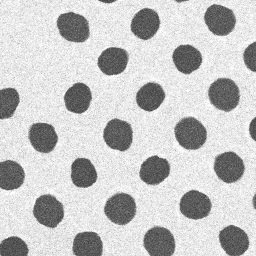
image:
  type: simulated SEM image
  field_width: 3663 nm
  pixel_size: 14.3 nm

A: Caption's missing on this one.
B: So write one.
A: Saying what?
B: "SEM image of a regular array of holes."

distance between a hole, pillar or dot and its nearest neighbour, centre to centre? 726 nanometres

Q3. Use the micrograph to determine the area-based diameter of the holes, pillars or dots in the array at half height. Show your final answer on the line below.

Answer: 436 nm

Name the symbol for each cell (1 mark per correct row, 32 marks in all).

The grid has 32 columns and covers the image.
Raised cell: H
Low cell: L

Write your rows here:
HHHHHHHHHHHHHHHHHHHHHHHHHHHHHHHH
HHHHHHHHHHHHHHHHHLLHHHHHHHLLLHHH
HHHHHHHLLLLHHHHHHLLLHHHHHHLLLHHH
HHHHHHHLLLLHHHHHLLLLHHHHHHLLLHHH
HHHHHHHHLLLHHHHHHLLHHHHHHHHHHHHH
HHHHHHHHHHHHHHHHHHHHHHHHHHHHHHHL
HHHHHHHHHHHHHLLLHHHHHHLLLHHHHHHL
HHHHHHHHHHHHLLLLHHHHHHLLLHHHHHHL
HHHHHHHHHHHHLLLLHHHHHHLLLHHHHHHL
HHHHHHHHHHHHHHHHHHHHHHHHHHHHHHHH
HHHHHHHHHLLHHHHHHHLLHHHHHHHLLHHH
LLHHHHHHLLLHHHHHHLLLHHHHHHLLLLHH
LLHHHHHHLLLHHHHHHLLLHHHHHHLLLLHH
LLHHHHHHLLLHHHHHHHLLHHHHHHHLLHHH
LHHHHHHHHHHHHHHHHHHHHHHHHHHHHHHH
HHHHLLHHHHHHHLLLHHHHHHLLLHHHHHHL
HHHHLLLHHHHHHLLLLHHHHHLLLLHHHHHL
HHHHLLLHHHHHHLLLLHHHHHLLLLHHHHHH
HHHHLLLHHHHHHHLLHHHHHHHLLHHHHHHH
HHHHHHHHHHHHHHHHHHHLHHHHHHHLLLHH
LLHHHHHHHLLLHHHHHHLLLHHHHHHLLLHH
LLLHHHHHHLLLHHHHHLLLLHHHHHHLLLHH
LLLHHHHHHLLLHHHHHHLLLHHHHHHHLLHH
LLHHHHHHHHHHHHHHHHHHHHHHHHHHHHHH
HHHHHLHHHHHHHHLLHHHHHHHLLLHHHHHH
HHHHLLLLHHHHHLLLLHHHHHLLLLHHHHHH
HHHHLLLLHHHHHLLLLHHHHHHLLLHHHHHH
HHHHHLLLHHHHHHLLHHHHHHHHHHHHHHHH
HHHHHHHHHHHHHHHHHHHLLHHHHHHHLLHH
HHHHHHHHHHLLHHHHHHLLLLHHHHHLLLLH
LLLHHHHHHLLLLHHHHHLLLLHHHHHHLLLH
LLLLHHHHHLLLLHHHHHLLLLHHHHHHLLLH